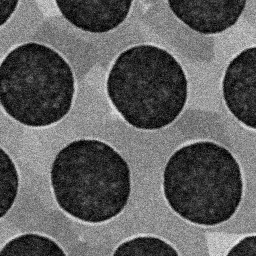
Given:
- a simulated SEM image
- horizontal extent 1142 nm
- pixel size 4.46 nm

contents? holes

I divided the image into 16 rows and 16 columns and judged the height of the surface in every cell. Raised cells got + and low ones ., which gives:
.+++....+++....+
+++++...++++...+
++++++++++++++++
....+++....++++.
.....++....+++..
.....++.....++..
....+++.....++..
+...++++...++++.
++++++++++++++++
++++...++++...++
.++.....++.....+
.++.....++.....+
.++.....++.....+
++++...++++....+
++++++++++++++++
....+++....++++.